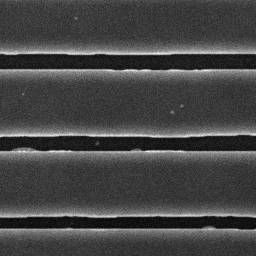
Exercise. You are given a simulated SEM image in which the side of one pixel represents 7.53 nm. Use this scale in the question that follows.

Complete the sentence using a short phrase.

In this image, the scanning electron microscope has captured lines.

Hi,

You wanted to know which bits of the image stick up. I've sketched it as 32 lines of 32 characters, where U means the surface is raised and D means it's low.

UUUUUUUUUUUUUUUUUUUUUUUUUUUUUUUU
UUUUUUUUUUUUUUUUUUUUUUUUUUUUUUUU
UUUUUUUUUUUUUUUUUUUUUUUUUUUUUUUU
UUUUUUUUUUUUUUUUUUUUUUUUUUUUUUUU
UUUUUUUUUUUUUUUUUUUUUUUUUUUUUUUU
UUUUUUUUUUUUUUUUUUUUUUUUUUUUUUUU
UUUUUUUUUUUUUUUUUUUUUUUUUUUUUUUU
DDDDDDDDDDDDDDDDDDDDDDDDDDDDDDDD
DDDDDDDDDDDDDDDDDDDDDDDDDDDDDDDD
UUUUUUUUUUUUUUUUUUUUUUUUUUUUUUUU
UUUUUUUUUUUUUUUUUUUUUUUUUUUUUUUU
UUUUUUUUUUUUUUUUUUUUUUUUUUUUUUUU
UUUUUUUUUUUUUUUUUUUUUUUUUUUUUUUU
UUUUUUUUUUUUUUUUUUUUUUUUUUUUUUUU
UUUUUUUUUUUUUUUUUUUUUUUUUUUUUUUU
UUUUUUUUUUUUUUUUUUUUUUUUUUUUUUUU
UUUUUUUUUUUUUUUUUUUUUUUUUUUUUUUU
DDDDDDDDDDDDDDDDDDDDDDDDDDDDDDDD
DDDDDDDDDDDDDDDDDDDDDDDDDDDDDDDD
UUUUUUUUUUUUUUUUUUUUUUUUUUUUUUUU
UUUUUUUUUUUUUUUUUUUUUUUUUUUUUUUU
UUUUUUUUUUUUUUUUUUUUUUUUUUUUUUUU
UUUUUUUUUUUUUUUUUUUUUUUUUUUUUUUU
UUUUUUUUUUUUUUUUUUUUUUUUUUUUUUUU
UUUUUUUUUUUUUUUUUUUUUUUUUUUUUUUU
UUUUUUUUUUUUUUUUUUUUUUUUUUUUUUUU
UUUUUUUUUUUUUUUUUUUUUUUUUUUUUUUU
DDDDDDDDDDDDDDDDDDDDDDDDDDDDDDDD
DDDDDDDDDDDDDDDDDDDDDDDDDDDDDDDD
UUUUUUUUUUUUUUUUUUUUUUUUUUUUUUUU
UUUUUUUUUUUUUUUUUUUUUUUUUUUUUUUU
UUUUUUUUUUUUUUUUUUUUUUUUUUUUUUUU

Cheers